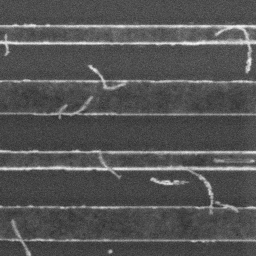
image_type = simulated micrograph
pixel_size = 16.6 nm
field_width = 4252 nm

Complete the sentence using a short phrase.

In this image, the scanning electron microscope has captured lines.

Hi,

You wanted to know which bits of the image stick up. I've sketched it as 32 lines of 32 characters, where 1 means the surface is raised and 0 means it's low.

00000000000000000000000000000000
00000000000000000000000000000000
00000000000000000000000000000000
11111111111111111111111111111111
11111111111111111111111111111111
00000000000000000000000000000000
00000000000000000000000000000000
00000000000000000000000000000000
00000000000000000000000000000000
00000000000000000000000000000000
11111111111111111111111111111111
11111111111111111111111111111111
11111111111111111111111111111111
11111111111111111111111111111111
00000000000000000000000000000000
00000000000000000000000000000000
00000000000000000000000000000000
00000000000000000000000000000000
00000000000000000000000000000000
11111111111111111111111111111111
11111111111111111111111111111111
00000000000000000000000000000000
00000000000000000000000000000000
00000000000000000000000000000000
00000000000000000000000000000000
00000000000000000000000000000000
11111111111111111111111111111111
11111111111111111111111111111111
11111111111111111111111111111111
11111111111111111111111111111111
00000000000000000000000000000000
00000000000000000000000000000000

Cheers